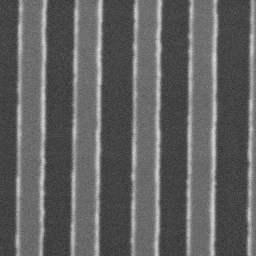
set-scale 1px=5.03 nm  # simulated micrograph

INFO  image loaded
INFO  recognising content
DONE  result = lines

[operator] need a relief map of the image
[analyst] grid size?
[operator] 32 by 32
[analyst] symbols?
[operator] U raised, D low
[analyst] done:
DDDUUUDDDDUUUDDDDUUUDDDDUUUDDDDU
DDDUUUDDDUUUUDDDDUUUDDDDUUUDDDDU
DDDUUUDDDUUUUDDDDUUUDDDDUUUDDDDU
DDUUUUDDDUUUUDDDDUUUDDDDUUUDDDDU
DDUUUUDDDUUUUDDDDUUUDDDDUUUDDDDU
DDUUUUDDDUUUUDDDDUUUDDDDUUUDDDDU
DDUUUUDDDUUUUDDDDUUUDDDDUUUDDDDU
DDUUUUDDDUUUDDDDDUUUDDDDUUUDDDDU
DDUUUUDDDUUUUDDDDUUUDDDDUUUDDDDU
DDUUUUDDDUUUUDDDDUUUDDDDUUUDDDDU
DDUUUUDDDUUUUDDDDUUUDDDDUUUDDDDU
DDUUUUDDDUUUDDDDDUUUDDDDUUUDDDDU
DDUUUUDDDUUUDDDDDUUUDDDDUUUDDDDU
DDUUUUDDDUUUDDDDDUUUDDDDUUUDDDDU
DDUUUUDDDUUUDDDDDUUUDDDDUUUDDDDU
DDUUUUDDDUUUDDDDDUUUDDDDUUUDDDDU
DDUUUUDDDUUUDDDDDUUUDDDDUUUDDDDU
DDUUUUDDDUUUDDDDDUUUDDDDUUUDDDDU
DDUUUDDDDUUUDDDDDUUUDDDDUUUDDDDU
DDUUUDDDDUUUDDDDDUUUDDDDUUUDDDDU
DDUUUUDDDUUUDDDDDUUUDDDDUUUDDDDU
DDUUUDDDDUUUDDDDDUUUDDDDUUUDDDDU
DDUUUDDDDUUUDDDDDUUUDDDUUUUDDDDU
DDUUUDDDDUUUDDDDDUUUDDDUUUUDDDDU
DDUUUDDDDUUUDDDDDUUUDDDUUUUDDDDU
DDUUUDDDDUUUDDDDDUUUDDDUUUUDDDDU
DDUUUDDDDUUUDDDDDUUUDDDUUUUDDDDU
DDUUUDDDDUUUDDDDDUUUDDDUUUUDDDDU
DDUUUDDDDUUUDDDDDUUUDDDUUUUDDDDU
DDUUUDDDDUUUDDDDDUUUDDDUUUUDDDDU
DDUUUDDDDUUUDDDDDUUUDDDUUUUDDDDU
DDUUUDDDDUUUDDDDDUUUDDDUUUUDDDDU